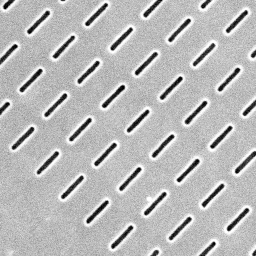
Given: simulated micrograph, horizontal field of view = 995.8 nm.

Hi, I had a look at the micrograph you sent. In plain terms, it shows a regular array of holes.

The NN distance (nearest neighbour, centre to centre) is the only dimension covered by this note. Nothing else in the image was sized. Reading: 136 nm